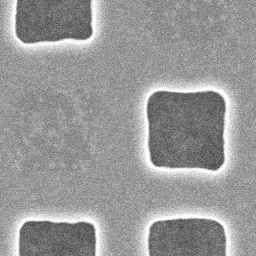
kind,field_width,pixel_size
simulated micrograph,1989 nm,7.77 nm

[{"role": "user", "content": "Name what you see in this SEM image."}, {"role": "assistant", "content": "holes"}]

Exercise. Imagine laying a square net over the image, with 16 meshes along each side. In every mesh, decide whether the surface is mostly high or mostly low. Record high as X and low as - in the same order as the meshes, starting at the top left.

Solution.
X-----XXXXXXXXXX
X-----XXXXXXXXXX
X---XXXXXXXXXXXX
XXXXXXXXXXXXXXXX
XXXXXXXXXXXXXXXX
XXXXXXXXXXXXXXXX
XXXXXXXXX-----XX
XXXXXXXXX-----XX
XXXXXXXXX-----XX
XXXXXXXXX-----XX
XXXXXXXXXX----XX
XXXXXXXXXXXXXXXX
XXXXXXXXXXXXXXXX
XXXXXXXXXXXXXXXX
X-----XXX-----XX
X-----XXX-----XX